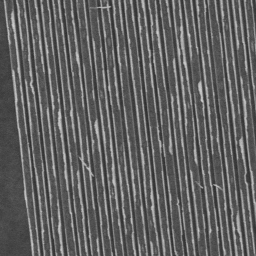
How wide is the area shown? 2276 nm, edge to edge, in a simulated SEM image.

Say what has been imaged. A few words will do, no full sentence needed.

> parallel lines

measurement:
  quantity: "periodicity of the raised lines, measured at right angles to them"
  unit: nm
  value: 106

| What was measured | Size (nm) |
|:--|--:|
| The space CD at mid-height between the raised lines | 29.8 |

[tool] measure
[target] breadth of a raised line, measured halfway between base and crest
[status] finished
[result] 77.3 nm